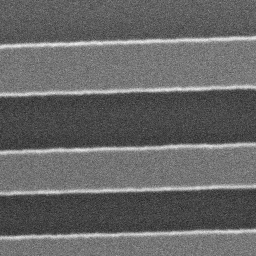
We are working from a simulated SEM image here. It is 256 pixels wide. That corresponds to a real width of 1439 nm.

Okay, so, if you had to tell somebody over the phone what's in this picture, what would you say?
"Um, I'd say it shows lines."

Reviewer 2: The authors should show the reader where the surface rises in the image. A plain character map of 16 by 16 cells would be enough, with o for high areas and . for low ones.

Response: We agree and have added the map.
................
................
............oooo
oooooooooooooooo
oooooooooooooooo
oooooooooooooo..
................
................
................
.ooooooooooooooo
oooooooooooooooo
oooooooooooooooo
................
................
............oooo
oooooooooooooooo